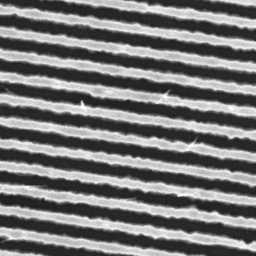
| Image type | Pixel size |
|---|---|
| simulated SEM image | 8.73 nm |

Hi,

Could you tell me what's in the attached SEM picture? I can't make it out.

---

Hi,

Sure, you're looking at parallel lines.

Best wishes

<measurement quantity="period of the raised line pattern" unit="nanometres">192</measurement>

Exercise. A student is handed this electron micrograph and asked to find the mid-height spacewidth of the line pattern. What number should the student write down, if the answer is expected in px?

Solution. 11.3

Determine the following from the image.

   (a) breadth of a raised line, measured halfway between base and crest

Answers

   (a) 0.0897 um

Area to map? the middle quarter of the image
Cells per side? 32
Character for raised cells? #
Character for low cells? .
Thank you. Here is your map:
#############.#.................
...#################.#..........
..........###################...
.................###############
#.#....................#########
##########....................##
#################...............
......##################.#......
.........####################...
....................############
######.....................#####
##############..................
..################..............
.........#################......
................################
##......................########
##########.....................#
###############.................
....####################........
...........###################..
...................#############
#####....................#######
###########.....................
..##################............
........#################.......
................################
......................##########
########......................##
################................
....################.#..#.......
............#################...
...................#############